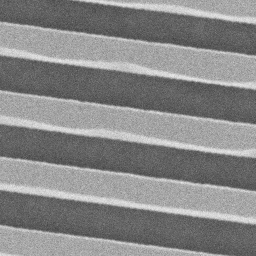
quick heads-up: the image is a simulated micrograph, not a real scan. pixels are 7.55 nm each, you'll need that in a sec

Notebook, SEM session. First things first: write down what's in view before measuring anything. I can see lines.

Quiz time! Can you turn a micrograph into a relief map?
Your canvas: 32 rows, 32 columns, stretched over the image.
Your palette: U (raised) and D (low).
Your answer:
DDDDDDDDDDDDDDUUUUUUUUUUUUUUUUUU
DDDDDDDDDDDDDDDDDDDDDDDDUUUUUUUU
DDDDDDDDDDDDDDDDDDDDDDDDDDDDDDUU
UUUUUDDDDDDDDDDDDDDDDDDDDDDDDDDD
UUUUUUUUUUUUUDDDDDDDDDDDDDDDDDDD
UUUUUUUUUUUUUUUUUUUUDDDDDDDDDDDD
DUUUUUUUUUUUUUUUUUUUUUUUUUUUDDDD
DDDDDDUUUUUUUUUUUUUUUUUUUUUUUUUU
DDDDDDDDDDDDDDDDUUUUUUUUUUUUUUUU
DDDDDDDDDDDDDDDDDDDDDUUUUUUUUUUU
DDDDDDDDDDDDDDDDDDDDDDDDDDDDDUUU
UDDDDDDDDDDDDDDDDDDDDDDDDDDDDDDD
UUUUUUUUDDDDDDDDDDDDDDDDDDDDDDDD
UUUUUUUUUUUUUUUUDDDDDDDDDDDDDDDD
UUUUUUUUUUUUUUUUUUUUUUUDDDDDDDDD
DDDUUUUUUUUUUUUUUUUUUUUUUUUUUUUD
DDDDDDDDDUUUUUUUUUUUUUUUUUUUUUUU
DDDDDDDDDDDDDDDDDDUUUUUUUUUUUUUU
DDDDDDDDDDDDDDDDDDDDDDDDUUUUUUUU
DDDDDDDDDDDDDDDDDDDDDDDDDDDDDDDD
UUUUUUUDDDDDDDDDDDDDDDDDDDDDDDDD
UUUUUUUUUUUUUUDDDDDDDDDDDDDDDDDD
UUUUUUUUUUUUUUUUUUUUUUDDDDDDDDDD
DUUUUUUUUUUUUUUUUUUUUUUUUUUUUDDD
DDDDDDDDUUUUUUUUUUUUUUUUUUUUUUUU
DDDDDDDDDDDDDDDUUUUUUUUUUUUUUUUU
DDDDDDDDDDDDDDDDDDDDDDDUUUUUUUUU
DDDDDDDDDDDDDDDDDDDDDDDDDDDDDDUU
UUDDDDDDDDDDDDDDDDDDDDDDDDDDDDDD
UUUUUUUUUUDDDDDDDDDDDDDDDDDDDDDD
UUUUUUUUUUUUUUUUUDDDDDDDDDDDDDDD
UUUUUUUUUUUUUUUUUUUUUUUUUDDDDDDD